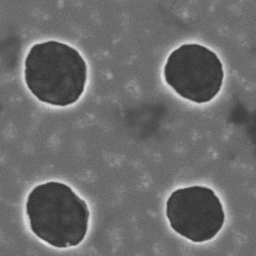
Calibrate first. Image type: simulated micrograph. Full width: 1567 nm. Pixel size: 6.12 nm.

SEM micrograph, holes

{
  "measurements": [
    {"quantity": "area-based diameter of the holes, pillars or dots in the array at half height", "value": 375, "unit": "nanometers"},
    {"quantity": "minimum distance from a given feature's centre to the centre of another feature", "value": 848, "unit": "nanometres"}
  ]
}